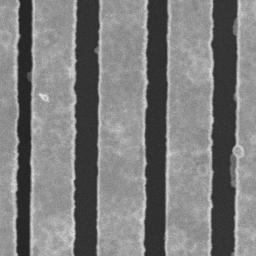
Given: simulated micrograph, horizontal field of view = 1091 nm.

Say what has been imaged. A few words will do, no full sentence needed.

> lines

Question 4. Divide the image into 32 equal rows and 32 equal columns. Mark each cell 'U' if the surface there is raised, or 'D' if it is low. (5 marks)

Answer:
UUDDUUUUUUDDUUUUUUDDDUUUUUUDDDUU
UUDDUUUUUUDDUUUUUUDDDUUUUUUDDDUU
UUDDUUUUUUDDUUUUUUDDDUUUUUUDDDUU
UUDDUUUUUDDDUUUUUUDDDUUUUUUDDDUU
UUDDUUUUUDDDUUUUUUDDDUUUUUUDDDUU
UUDDUUUUUDDDUUUUUUDDDUUUUUDDDDUU
UUDDUUUUUDDDUUUUUUDDDUUUUUUDDDUU
UUDDUUUUUDDDUUUUUUDDDUUUUUUDDDUU
UUDDUUUUUDDDUUUUUUDDDUUUUUUDDDUU
UUDDUUUUUDDDUUUUUUDDDUUUUUUDDDUU
UUDDUUUUUDDDUUUUUUDDDUUUUUUDDDUU
UUDDUUUUUDDDUUUUUUDDDUUUUUUDDDUU
UUDDUUUUUDDDUUUUUUDDDUUUUUUDDDUU
UUDDUUUUUDDDUUUUUUDDDUUUUUUDDDUU
UUDDUUUUUDDDUUUUUUDDDUUUUUUDDDUU
UUDDUUUUUDDDUUUUUUDDDUUUUUUDDDUU
UUDDUUUUUDDDUUUUUUDDDUUUUUDDDDUU
UUDDUUUUUDDDUUUUUUDDDUUUUUUDDDUU
UUDDUUUUUDDDUUUUUUDDDUUUUUDDDUUU
UUDDUUUUUDDDUUUUUUDDDUUUUUDDDUUU
UUDDUUUUUDDDUUUUUUDDDUUUUUDDDDUU
UUDDUUUUUDDDUUUUUUDDDUUUUUUDDUUU
UUDDUUUUUDDDUUUUUUDDDUUUUUUDDDUU
UUDDUUUUUDDDUUUUUUDDDUUUUUDDDDUU
UUDDUUUUUDDDUUUUUUDDDUUUUUDDDDUU
UUDDUUUUUDDDUUUUUUDDDUUUUUUDDUUU
UUDDUUUUUDDDUUUUUUDDDUUUUUDDDUUU
UUDDUUUUUDDDUUUUUUDDDUUUUUDDDUUU
UUDDUUUUUDDDUUUUUUDDDUUUUUDDDUUU
UUDDUUUUUDDDUUUUUUDDDUUUUUDDDUUU
UUDDUUUUUDDDUUUUUUDDDUUUUUDDDUUU
UUDDUUUUUDDDUUUUUUDDDUUUUUDDDUUU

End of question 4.